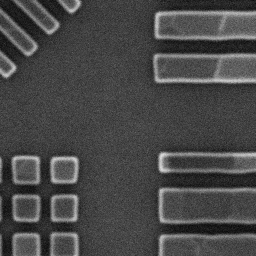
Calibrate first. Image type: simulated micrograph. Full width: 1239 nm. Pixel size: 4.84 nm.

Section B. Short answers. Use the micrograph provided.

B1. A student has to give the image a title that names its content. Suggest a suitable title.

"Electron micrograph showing groups of lines, slits or small figures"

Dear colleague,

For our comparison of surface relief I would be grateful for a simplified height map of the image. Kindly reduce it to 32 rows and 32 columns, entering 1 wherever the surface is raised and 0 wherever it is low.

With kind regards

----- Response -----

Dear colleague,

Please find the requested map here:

00111000110000000000000000000000
00011100000000000000000000000000
10001110000000000000111111111111
11000110000000000000111111111111
01110000000000000000111111111111
00110000000000000000000000000000
00010000000000000000000000000000
10000000000000000001111111111111
11000000000000000001111111111111
00000000000000000001111111111111
00000000000000000000000000000000
00000000000000000000000000000000
00000000000000000000000000000000
00000000000000000000000000000000
00000000000000000000000000000000
00000000000000000000000000000000
00000000000000000000000000000000
00000000000000000000000000000000
00000000000000000000000000000000
00000000000000000000111111111111
00111011110000000000111111111111
00111011110000000000000000001110
00111001100000000000000000000000
00000000000000000000000000000000
00000000100000000000111111111111
00111001110000000000111111111111
00111001100000000000111111111111
00110001100000000000111111111111
00000000000000000000000000000000
00111001100000000000111111011111
00111011110000000000111111111111
00111011110000000000111111111111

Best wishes